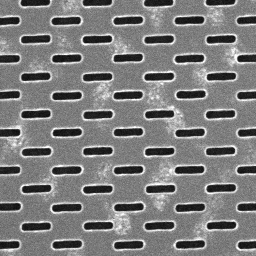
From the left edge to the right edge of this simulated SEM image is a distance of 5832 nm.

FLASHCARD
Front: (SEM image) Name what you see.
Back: a regular array of holes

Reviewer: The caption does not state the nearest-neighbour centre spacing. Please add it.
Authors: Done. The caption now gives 812 nm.